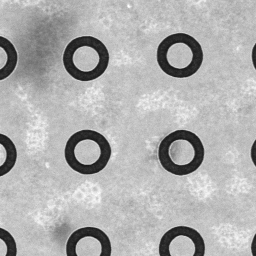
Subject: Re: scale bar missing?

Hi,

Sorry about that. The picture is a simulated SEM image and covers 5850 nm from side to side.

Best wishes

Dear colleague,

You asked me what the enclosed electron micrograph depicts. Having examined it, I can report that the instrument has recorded ring-shaped grooves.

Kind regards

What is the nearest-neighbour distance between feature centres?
2140 nm